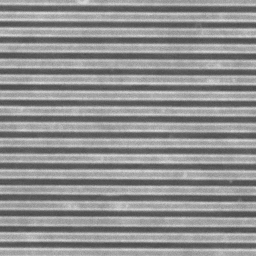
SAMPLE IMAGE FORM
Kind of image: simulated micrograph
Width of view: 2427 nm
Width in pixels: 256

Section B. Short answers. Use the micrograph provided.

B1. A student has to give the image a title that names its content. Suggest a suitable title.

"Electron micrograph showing parallel lines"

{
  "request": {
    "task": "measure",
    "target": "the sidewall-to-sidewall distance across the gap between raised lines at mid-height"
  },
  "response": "0.0688 µm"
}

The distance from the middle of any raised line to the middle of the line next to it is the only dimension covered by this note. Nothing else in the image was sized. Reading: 150 nm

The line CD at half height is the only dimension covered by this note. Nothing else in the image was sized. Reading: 86.5 nm